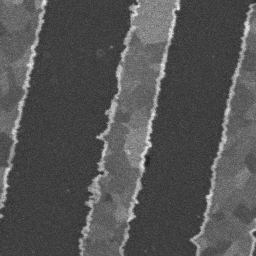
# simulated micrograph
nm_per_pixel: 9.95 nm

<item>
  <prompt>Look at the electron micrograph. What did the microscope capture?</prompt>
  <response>one or a few lines or trenches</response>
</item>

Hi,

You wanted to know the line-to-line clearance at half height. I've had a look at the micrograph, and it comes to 742 nanometers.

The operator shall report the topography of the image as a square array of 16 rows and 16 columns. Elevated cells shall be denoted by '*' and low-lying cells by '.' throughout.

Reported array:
***.....***.....
***.....***....*
**......***....*
**......**.....*
**.....***.....*
**.....***.....*
*......***....**
*......**.....**
*......**.....**
*......**.....**
*.....***....***
......***....***
......**.....***
......**.....***
.....***.....***
.....***....****